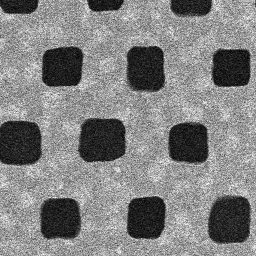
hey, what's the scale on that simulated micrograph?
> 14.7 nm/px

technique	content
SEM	a regular array of holes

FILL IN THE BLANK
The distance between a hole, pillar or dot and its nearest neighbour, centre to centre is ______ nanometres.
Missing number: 1230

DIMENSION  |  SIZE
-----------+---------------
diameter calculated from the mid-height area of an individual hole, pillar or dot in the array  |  634 nm